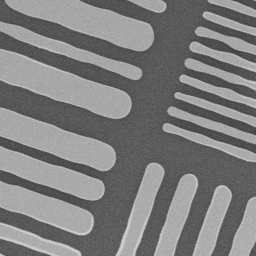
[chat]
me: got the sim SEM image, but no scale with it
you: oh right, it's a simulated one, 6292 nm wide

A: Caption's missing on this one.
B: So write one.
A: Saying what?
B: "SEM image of groups of lines, slits or small figures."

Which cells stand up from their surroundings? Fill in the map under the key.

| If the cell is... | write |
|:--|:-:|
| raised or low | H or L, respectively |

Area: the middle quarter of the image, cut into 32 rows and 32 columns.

LLLLLLLLLHHHHHHHHLLLLLLLLLLLLLHH
LLLLLLLLLLLHHHHHHHHLLLLLLLLLLLLL
HHLLLLLLLLLLLLHHHHHLLLLLLLLLLLLL
HHHHLLLLLLLLLLLLHHHLLLLLLLLLLHHH
HHHHHHHLLLLLLLLLLLLLLLLLLLLLLLHH
HHHHHHHHHHLLLLLLLLLLLLLLLLLLLLLL
HHHHHHHHHHHHHHLLLLLLLLLLLLLLLLLL
HHHHHHHHHHHHHHHHLLLLLLLLLLLLHLLL
HHHHHHHHHHHHHHHHLLLLLLLLLLLLHHHH
HHHHHHHHHHHHHHHHHLLLLLLLLLLLLLLH
LLLLHHHHHHHHHHHHHLLLLLLLLLLLLLLL
LLLLLLHHHHHHHHHHLLLLLLLLLLHHHLLL
LLLLLLLLLHHHHHHHLLLLLLLLLLHHHHHH
LLLLLLLLLLLLHHLLLLLLLLLLLLLLLHHH
LLLLLLLLLLLLLLLLLLLLLLLLLLLLLLLL
LLLLLLLLLLLLLLLLLLLLLLLLLHHLLLLL
LLLLLLLLLLLLLLLLLLLLLLLLLHHHHHLL
HHHLLLLLLLLLLLLLLLLLLLLLLLLLHHHH
HHHHHHLLLLLLLLLLLLLLLLLLLLLLLLLH
HHHHHHHHHLLLLLLLLLLLLLLLLLLLLLLL
HHHHHHHHHHHHLLLLLLLLLLLLLLLLLLLL
HHHHHHHHHHHHLLLLLLLLLLLLLLLLLLLL
HHHHHHHHHHHHHLLLLLLLLLLLLLLLLLLL
HHHHHHHHHHHHHLLLLLLLLLLLLLLLLLLL
LLLHHHHHHHHHHLLLLLLLLLLLLLLLLLLL
LLLLLLHHHHHHLLLLLLLLLHHHLLLLLLLL
HHLLLLLLLHHLLLLLLLLLHHHHHLLLLLLL
HHHHHLLLLLLLLLLLLLLLHHHHHLLLLLLL
HHHHHHHLLLLLLLLLLLLLHHHHHLLLLLHH
HHHHHHHHHHLLLLLLLLLLHHHHLLLLLHHH
HHHHHHHHHHLLLLLLLLLHHHHHLLLLHHHH
HHHHHHHHHHLLLLLLLLLHHHHLLLLLHHHH